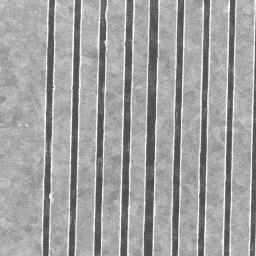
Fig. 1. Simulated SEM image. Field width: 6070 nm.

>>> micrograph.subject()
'parallel lines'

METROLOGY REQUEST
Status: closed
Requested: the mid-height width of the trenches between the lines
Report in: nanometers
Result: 166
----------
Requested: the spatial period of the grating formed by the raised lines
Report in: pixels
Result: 25.8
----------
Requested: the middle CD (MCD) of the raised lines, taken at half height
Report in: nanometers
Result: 453